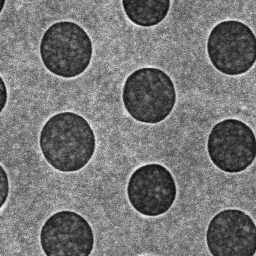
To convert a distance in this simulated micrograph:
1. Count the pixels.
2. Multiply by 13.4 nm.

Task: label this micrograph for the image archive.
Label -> holes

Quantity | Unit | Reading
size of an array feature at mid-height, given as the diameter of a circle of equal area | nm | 733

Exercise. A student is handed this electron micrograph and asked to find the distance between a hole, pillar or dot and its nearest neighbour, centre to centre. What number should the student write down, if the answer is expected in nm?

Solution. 1250